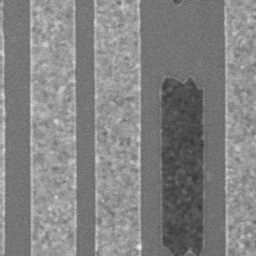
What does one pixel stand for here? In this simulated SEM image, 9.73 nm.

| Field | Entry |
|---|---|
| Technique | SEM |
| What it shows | one or a few lines or trenches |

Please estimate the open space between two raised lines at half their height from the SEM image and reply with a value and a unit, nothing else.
210 nm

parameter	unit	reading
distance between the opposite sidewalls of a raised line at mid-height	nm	424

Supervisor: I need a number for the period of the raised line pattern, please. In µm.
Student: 0.626